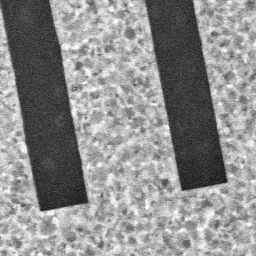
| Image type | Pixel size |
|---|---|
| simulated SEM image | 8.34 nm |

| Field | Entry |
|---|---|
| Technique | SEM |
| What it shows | one or a few lines or trenches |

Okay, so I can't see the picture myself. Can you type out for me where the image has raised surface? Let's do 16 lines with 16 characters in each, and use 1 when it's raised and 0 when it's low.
0001111110001111
0000111110000111
0000111110000111
0000111111000111
1000111111000111
1000111111000111
1000111111000111
1000011111000011
1000011111000011
1100011111100011
1100011111100011
1100011111100011
1100001111111111
1111111111111111
1111111111111111
1111111111111111